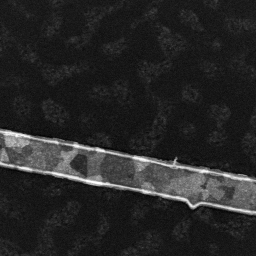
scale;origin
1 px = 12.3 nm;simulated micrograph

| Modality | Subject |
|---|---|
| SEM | one or a few lines or trenches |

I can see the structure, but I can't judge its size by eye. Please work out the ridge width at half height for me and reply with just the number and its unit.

390 nm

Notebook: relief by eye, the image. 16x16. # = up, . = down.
................
................
................
................
................
................
................
................
##..............
#######.........
.###########....
......##########
...........#####
................
................
................